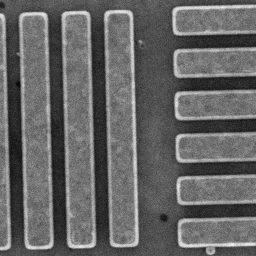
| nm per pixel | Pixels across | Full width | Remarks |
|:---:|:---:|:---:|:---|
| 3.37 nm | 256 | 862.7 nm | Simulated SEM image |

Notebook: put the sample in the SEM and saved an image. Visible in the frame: groups of lines, slits or small figures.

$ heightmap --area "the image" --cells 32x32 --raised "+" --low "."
................................
..............++......++++++++++
...+++..+++..+++......++++++++++
...+++..+++..+++......++++++++++
...+++..+++..+++................
...+++..+++..+++................
+..+++..+++..++++.....++++++++++
+..+++..+++..++++.....++++++++++
+..+++..+++..++++.....++++++++++
+..+++..+++..++++...............
+..+++..+++..++++...............
+..+++..+++..++++..........+++++
+..+++..+++..++++.....++++++++++
+..+++..+++..++++.....++++++++++
+..+++..+++...+++.....++++++++++
+..+++..+++...+++...............
+..+++..+++...+++...............
+..+++..+++...+++.....++++++++++
+..+++..++++..+++.....++++++++++
+..+++..++++..+++.....++++++++++
+..+++..++++..+++...............
+..+++..++++..+++...............
+..+++..++++..+++......+++++++++
+..+++..++++..+++.....++++++++++
+..+++..++++..+++.....++++++++++
+..+++..++++..+++...............
+..+++..++++..+++...............
+..+++...+++..+++.........++++++
+..+++...+++..+++......+++++++++
+..+++...+++..+++......+++++++++
+..+++...+++..+++......+++++++++
................................